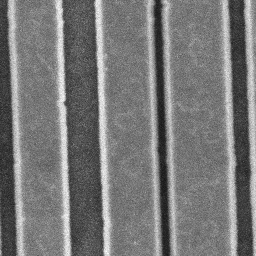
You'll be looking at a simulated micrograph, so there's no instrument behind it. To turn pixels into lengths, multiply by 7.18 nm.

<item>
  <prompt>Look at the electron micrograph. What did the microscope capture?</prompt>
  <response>one or a few lines or trenches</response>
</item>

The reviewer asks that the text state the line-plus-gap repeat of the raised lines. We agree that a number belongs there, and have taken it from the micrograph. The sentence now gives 573 nm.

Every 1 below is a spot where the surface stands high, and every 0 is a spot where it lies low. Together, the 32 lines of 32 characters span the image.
01111110000011111110011111110001
01111111000011111110011111110001
01111111000011111110011111110001
01111111000011111110011111110001
01111111000011111110011111110001
01111111000011111110011111110001
00111111000001111110011111110001
00111111000001111110011111111001
00111111000001111110011111110001
00111111000001111110011111111001
00111111000001111110011111111001
00111111000001111110011111111001
00111111000001111110011111111001
00111111000001111110011111111001
00111111000001111110011111111001
00111111000001111110011111111001
00111111000001111110011111111001
00111111000001111110011111111000
00111111000001111110011111111000
00111111000001111110011111111000
00111111000001111111011111111000
00111111000001111111011111111000
00111111000001111111011111111000
00111111000001111111011111111000
00111111000001111111011111111000
00111111000001111111011111111000
00111111000001111111011111111000
00111111000001111111011111111000
00111111000001111111001111111000
00111111000001111111001111111000
00111111000001111111001111111000
00011111000001111111001111111000